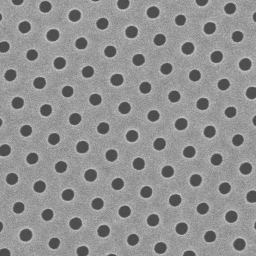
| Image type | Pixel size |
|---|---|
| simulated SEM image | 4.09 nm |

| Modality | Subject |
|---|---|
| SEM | a regular array of holes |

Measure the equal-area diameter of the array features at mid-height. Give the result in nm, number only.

51.1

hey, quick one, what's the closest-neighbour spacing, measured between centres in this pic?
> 117 nanometres